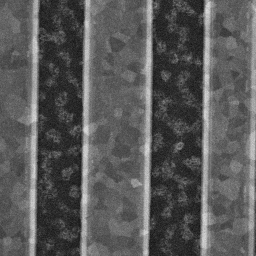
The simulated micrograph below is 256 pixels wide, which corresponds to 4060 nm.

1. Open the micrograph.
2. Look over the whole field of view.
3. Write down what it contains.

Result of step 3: one or a few lines or trenches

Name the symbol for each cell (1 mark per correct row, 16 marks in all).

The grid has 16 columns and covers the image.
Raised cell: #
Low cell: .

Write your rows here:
##...####....###
##...####....###
##...####....###
##...####....###
##...####....###
##...####....###
##...####....###
##...####....###
##...####....###
##...####....###
##...####....###
##...####....###
##...####....###
##...####....###
##...####....###
##...####....###